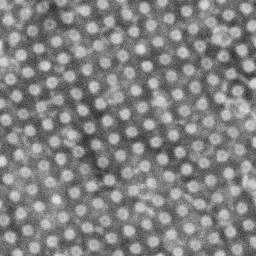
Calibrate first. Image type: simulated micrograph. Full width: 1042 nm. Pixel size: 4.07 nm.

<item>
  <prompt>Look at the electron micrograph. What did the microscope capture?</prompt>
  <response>a regular array of raised bodies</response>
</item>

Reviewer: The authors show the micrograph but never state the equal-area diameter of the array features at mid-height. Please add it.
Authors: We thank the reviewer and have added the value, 37.9 nm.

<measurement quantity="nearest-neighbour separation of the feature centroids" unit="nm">74.6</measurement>